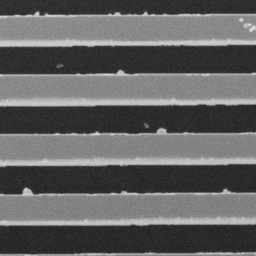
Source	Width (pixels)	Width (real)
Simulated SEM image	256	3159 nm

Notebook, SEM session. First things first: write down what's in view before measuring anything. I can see lines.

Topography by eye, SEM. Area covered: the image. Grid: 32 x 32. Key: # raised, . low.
................................
................................
################################
################################
################################
##########################......
................................
................................
................................
################################
################################
################################
################################
................................
................................
................................
................................
################################
################################
################################
######..........................
................................
................................
................................
################################
################################
################################
################################
................................
................................
................................
................................